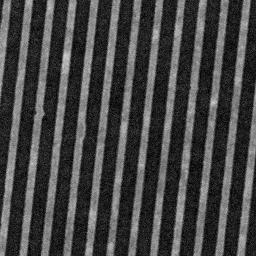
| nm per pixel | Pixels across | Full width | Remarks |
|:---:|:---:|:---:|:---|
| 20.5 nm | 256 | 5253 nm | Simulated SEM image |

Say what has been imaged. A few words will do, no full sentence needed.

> parallel lines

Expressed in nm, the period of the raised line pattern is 444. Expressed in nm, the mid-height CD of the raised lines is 135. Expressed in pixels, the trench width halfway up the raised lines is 15.2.